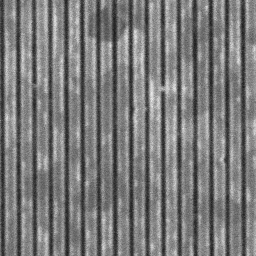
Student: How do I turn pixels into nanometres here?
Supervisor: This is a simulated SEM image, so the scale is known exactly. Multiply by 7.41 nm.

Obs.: parallel lines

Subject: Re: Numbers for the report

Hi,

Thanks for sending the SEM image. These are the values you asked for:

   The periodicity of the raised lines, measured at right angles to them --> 119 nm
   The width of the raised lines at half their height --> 73.1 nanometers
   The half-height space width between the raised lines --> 0.0463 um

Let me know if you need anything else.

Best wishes